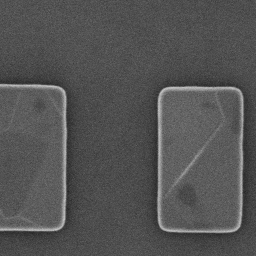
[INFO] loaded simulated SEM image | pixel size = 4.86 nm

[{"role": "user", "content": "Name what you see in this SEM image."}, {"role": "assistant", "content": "wiring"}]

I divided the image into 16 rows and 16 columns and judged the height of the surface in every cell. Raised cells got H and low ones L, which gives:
LLLLLLLLLLLLLLLL
LLLLLLLLLLLLLLLL
LLLLLLLLLLLLLLLL
LLLLLLLLLLLLLLLL
LLLLLLLLLLLLLLLL
HHHHLLLLLLLHHHHL
HHHHLLLLLLHHHHHL
HHHHLLLLLLHHHHHL
HHHHLLLLLLHHHHHL
HHHHLLLLLLHHHHHL
HHHHLLLLLLHHHHHL
HHHHLLLLLLHHHHHL
HHHHLLLLLLHHHHHL
HHHHLLLLLLHHHHHL
LLLLLLLLLLLLLLLL
LLLLLLLLLLLLLLLL